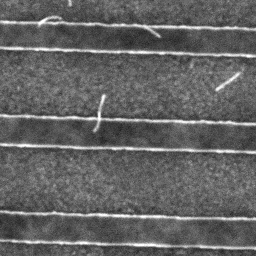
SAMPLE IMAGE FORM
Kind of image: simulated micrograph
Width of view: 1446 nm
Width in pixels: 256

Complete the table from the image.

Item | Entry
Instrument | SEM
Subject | lines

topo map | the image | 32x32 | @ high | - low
--------------------------------
--------------------------------
--------------------------------
@@@@@@@@@@@@@@@@@@@@@@@@@@@-@@--
@@@@@@@@@@@@@@@@@@@@@@@@@@@@@@@@
@@@@@@@@@@@@@@@@@@@@@@@@@@@@@@@@
-------------@@-@@@@@@@@@@@@@@@@
--------------------------------
--------------------------------
--------------------------------
--------------------------------
--------------------------------
--------------------------------
--------------------------------
@-------------------------------
@@@@@@@@@@@@@@@@@@@@@@@@@@@@@@@@
@@@@@@@@@@@@@@@@@@@@@@@@@@@@@@@@
@@@@@@@@@@@@@@@@@@@@@@@@@@@@@@@@
---------@@@@@@@@@@@@@@@@@@@@@@@
--------------------------------
--------------------------------
--------------------------------
--------------------------------
--------------------------------
--------------------------------
--------------------------------
@@------------------------------
@@@@@@@@@@@@@@@@@@@@@@@@@@@@@@@@
@@@@@@@@@@@@@@@@@@@@@@@@@@@@@@@@
@@@@@@@@@@@@@@@@@@@@@@@@@@@@@@@@
------------@@@@@@@@@@@@@@@@@@@@
--------------------------------